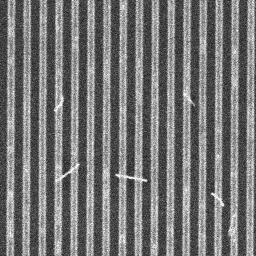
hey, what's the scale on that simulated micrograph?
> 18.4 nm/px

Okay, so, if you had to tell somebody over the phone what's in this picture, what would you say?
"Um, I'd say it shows parallel lines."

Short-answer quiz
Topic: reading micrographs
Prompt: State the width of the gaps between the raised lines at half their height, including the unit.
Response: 163 nanometres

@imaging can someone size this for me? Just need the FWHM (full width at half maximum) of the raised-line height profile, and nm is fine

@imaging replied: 126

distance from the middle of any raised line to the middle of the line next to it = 16 px